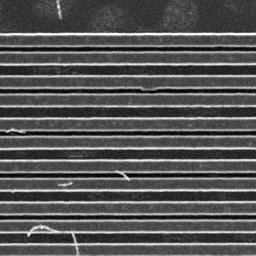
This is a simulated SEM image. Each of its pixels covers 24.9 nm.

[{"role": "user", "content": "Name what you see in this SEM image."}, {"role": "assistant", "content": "parallel lines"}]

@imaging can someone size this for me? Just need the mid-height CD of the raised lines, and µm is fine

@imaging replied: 0.314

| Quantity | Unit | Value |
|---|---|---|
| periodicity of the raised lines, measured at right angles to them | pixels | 20.7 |